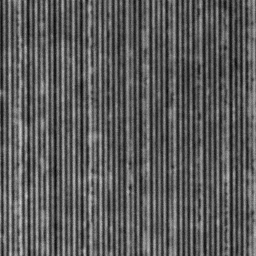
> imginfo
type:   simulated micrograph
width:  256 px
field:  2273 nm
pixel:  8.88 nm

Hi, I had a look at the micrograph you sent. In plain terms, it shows parallel lines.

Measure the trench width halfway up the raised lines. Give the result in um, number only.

0.0344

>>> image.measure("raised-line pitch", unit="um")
0.0473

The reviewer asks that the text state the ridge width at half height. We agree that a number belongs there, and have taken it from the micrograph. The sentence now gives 17.8 nanometers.